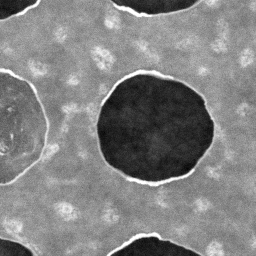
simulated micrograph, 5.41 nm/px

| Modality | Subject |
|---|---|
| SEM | holes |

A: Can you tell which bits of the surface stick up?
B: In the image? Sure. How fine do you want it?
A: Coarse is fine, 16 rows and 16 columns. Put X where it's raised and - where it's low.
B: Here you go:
--XXXXXX----XXXX
XXXXXXXXXXXXXXXX
XXXXXXXXXXXXXXXX
XXXXXXXXXXXXXXXX
XXXXXXXXXXXXXXXX
--XXXXX-----XXXX
--XXXX-------XXX
--XXXX-------XXX
--XXXX-------XXX
--XXXX-------XXX
-XXXXXX-----XXXX
XXXXXXXXXXXXXXXX
XXXXXXXXXXXXXXXX
XXXXXXXXXXXXXXXX
XXXXXXXXXXXXXXXX
--XXXXXX----XXXX